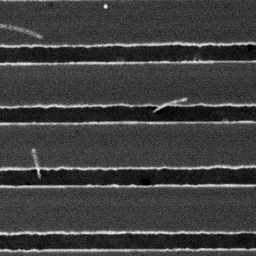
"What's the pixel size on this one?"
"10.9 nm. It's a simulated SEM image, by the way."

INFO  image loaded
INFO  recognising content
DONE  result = lines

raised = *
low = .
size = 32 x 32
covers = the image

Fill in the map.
********************************
********************************
********************************
********************************
********************************
********************************
................................
................................
********************************
********************************
********************************
********************************
********************************
................................
................................
********************************
********************************
********************************
********************************
********************************
********************************
................................
................................
********************************
********************************
********************************
********************************
********************************
********************************
................................
................................
********************************